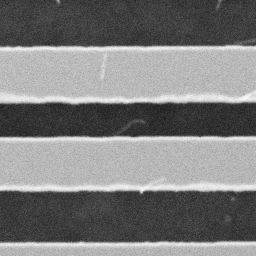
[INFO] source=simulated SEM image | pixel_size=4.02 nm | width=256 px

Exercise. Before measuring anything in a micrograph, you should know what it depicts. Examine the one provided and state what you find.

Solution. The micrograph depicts lines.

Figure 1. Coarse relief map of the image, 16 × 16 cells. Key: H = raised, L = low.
LLLLLLLLLLLLLLLL
LLLLLLLLLLLLLLLL
LLLLLLLLLLLLLLLL
HHHHHHHHHHHHHHHH
HHHHHHHHHHHHHHHH
HHHHHHHHHHHHHHHH
LLLLLLLLLLLLLLLL
LLLLLLLLLLLLLLLL
LLLLLLLLLLLLLLLL
HHHHHHHHHHHHHHHH
HHHHHHHHHHHHHHHH
HHHHHHHHHHHHHHHH
LLLLLLLLLLLLLLLL
LLLLLLLLLLLLLLLL
LLLLLLLLLLLLLLLL
HHHHHHHHHHHHHHHH